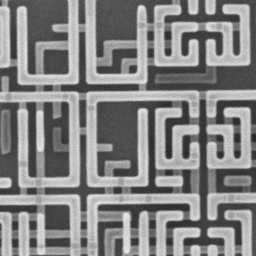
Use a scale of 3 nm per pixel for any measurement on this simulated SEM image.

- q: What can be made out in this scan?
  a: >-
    wiring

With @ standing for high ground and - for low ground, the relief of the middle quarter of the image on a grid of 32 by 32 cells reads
-@@@--@@----------@@@-----------
-@@@--@@----------@@@-----------
-@@@--@@@---------@@@-----------
@@@@--@@@@@@@@@@@@@@@-----------
@@@@--@@@@@@@@@@@@@@@-----------
--------------------------------
--------------------------------
@@@@--@@@@@@@@@@@@@@@@@@@@@@@@@@
@@@@--@@@@@@@@@@@@@@@@@@@@@@@@@@
-@@@--@@-----------------------@
-@@@--@@-----------------------@
-@@@--@@-----------@@--@@@@@@--@
-@@@--@@-----------@@--@@@@@@--@
-@@@--@@-----------@@--@@@------
-@@@--@@-----------@@--@@-------
-@@@--@@-----------@@--@@---@@@@
-@@@--@@-----------@@--@@--@@@@@
-@@@--@@-----------@@--@@--@@@@-
-@@@--@@-----------@@--@@--@@---
-@@@--@@-----------@@--@@--@@---
-@@@--@@-----------@@--@@--@@--@
-@@@--@@-----------@@--@@--@@--@
-@@@--@@-----------@@--@@--@@--@
-@@@--@@-----------@@--@@@-@@@-@
-@@@--@@-----------@@--@@@@@@@@@
-@@@--@@-----------@@--@@@@@@@@@
--@@--@@-----------@@-----------
-@@@--@@-----------@@-----------
@@@@--@@@@@@@@@@@@@@@--@@@@@@@--
@@@@--@@@@@@@@@@@@@@@--@@@@@@@--
@@@---@@@@----------------------
--------------------------------